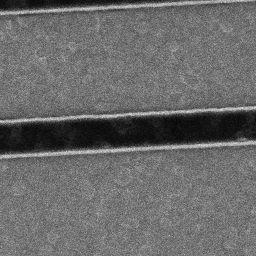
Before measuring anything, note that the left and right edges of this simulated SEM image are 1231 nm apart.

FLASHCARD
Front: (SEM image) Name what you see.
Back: one or a few lines or trenches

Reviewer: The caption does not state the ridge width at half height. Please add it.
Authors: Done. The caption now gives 174 nm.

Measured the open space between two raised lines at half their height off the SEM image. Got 516 nm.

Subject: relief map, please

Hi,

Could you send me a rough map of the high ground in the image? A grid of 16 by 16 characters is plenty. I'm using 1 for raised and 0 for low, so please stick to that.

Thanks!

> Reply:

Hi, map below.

1111111000000000
0000000000000000
0000000000000000
0000000000000000
0000000000000000
0000000000000000
0000000000000000
0111111111111111
1111111111111111
1111110000000000
0000000000000000
0000000000000000
0000000000000000
0000000000000000
0000000000000000
0000000000000000